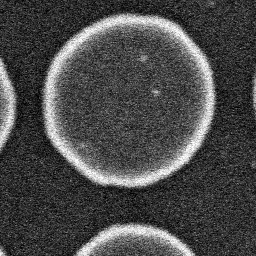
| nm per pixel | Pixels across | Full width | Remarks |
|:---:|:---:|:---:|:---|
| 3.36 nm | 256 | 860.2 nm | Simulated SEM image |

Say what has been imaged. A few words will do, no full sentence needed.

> raised bodies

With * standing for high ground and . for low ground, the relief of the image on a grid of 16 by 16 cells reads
................
......****......
.....*******....
....*********...
...**********...
*..**********...
*..**********...
*..**********...
...**********...
....********....
.....******.....
................
................
................
.......***......
.....******.....